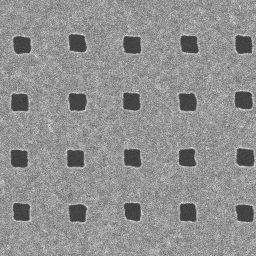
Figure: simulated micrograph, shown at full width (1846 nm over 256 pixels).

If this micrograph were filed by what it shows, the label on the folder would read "a regular array of holes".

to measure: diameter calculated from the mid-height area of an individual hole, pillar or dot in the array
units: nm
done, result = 136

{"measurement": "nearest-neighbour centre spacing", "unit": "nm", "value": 394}